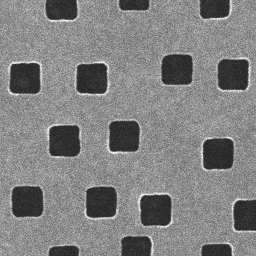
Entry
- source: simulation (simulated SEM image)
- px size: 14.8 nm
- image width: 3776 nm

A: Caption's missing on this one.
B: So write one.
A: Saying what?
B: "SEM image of a regular array of holes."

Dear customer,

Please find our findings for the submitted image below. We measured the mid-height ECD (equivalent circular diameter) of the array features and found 504 nanometers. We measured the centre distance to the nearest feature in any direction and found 59.9 px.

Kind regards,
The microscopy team